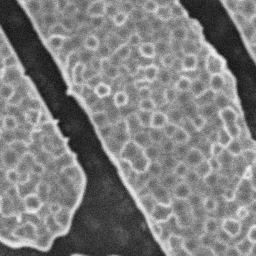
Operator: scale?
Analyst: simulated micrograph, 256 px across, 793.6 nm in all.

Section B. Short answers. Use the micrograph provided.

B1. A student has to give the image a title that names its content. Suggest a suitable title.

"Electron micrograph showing one or a few lines or trenches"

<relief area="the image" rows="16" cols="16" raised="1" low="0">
0111111111100011
0011111111110001
0001111111111001
1001111111111100
1100111111111100
1100111111111110
1110011111111110
1110001111111110
1111001111111111
1111000111111111
1111100111111111
1111100011111111
1111100011111111
1111100001111111
1111000000111111
0010000000111111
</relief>